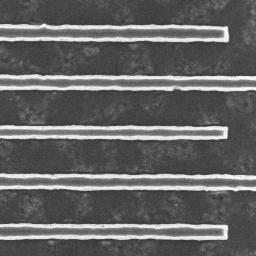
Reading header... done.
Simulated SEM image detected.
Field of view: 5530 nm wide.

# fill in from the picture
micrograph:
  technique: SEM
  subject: parallel lines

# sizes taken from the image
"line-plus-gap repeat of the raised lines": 1070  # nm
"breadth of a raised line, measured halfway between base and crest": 270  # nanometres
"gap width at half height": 0.81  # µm